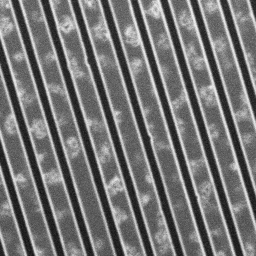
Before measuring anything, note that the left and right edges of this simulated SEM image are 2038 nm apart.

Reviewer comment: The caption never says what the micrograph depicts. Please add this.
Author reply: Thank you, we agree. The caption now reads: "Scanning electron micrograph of parallel lines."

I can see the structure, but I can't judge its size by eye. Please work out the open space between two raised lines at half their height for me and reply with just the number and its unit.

0.0706 um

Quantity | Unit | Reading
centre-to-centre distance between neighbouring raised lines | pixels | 28.6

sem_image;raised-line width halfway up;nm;157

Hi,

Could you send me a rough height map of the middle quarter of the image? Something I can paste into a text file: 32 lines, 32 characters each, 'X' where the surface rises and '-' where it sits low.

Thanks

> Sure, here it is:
-XXXXX---XXXXX--XXXXX---XXXXX--X
-XXXXX---XXXXX---XXXX---XXXXX--X
--XXXXX--XXXXX---XXXXX--XXXXX---
--XXXXX---XXXXX--XXXXX---XXXX---
--XXXXX---XXXXX--XXXXX---XXXXX--
---XXXXX--XXXXX---XXXXX--XXXXX--
X--XXXXX---XXXX---XXXXX---XXXX--
X--XXXXX---XXXXX--XXXXX---XXXXX-
X---XXXXX--XXXXX---XXXXX--XXXXX-
XX--XXXXX--XXXXX---XXXXX--XXXXX-
XX--XXXXX---XXXXX--XXXXX---XXXXX
XX---XXXX---XXXXX---XXXX---XXXXX
XXX--XXXXX--XXXXX---XXXXX--XXXXX
XXX--XXXXX---XXXXX--XXXXX---XXXX
XXX--XXXXXX--XXXXX--XXXXX---XXXX
XXX---XXXXX--XXXXX---XXXXX--XXXX
XXXX--XXXXX---XXXX---XXXXX--XXXX
XXXX--XXXXX---XXXXX--XXXXX---XXX
XXXX---XXXXX--XXXXX---XXXX---XXX
XXXX---XXXXX--XXXXX---XXXXX--XXX
XXXXX--XXXXX---XXXXX--XXXXX---XX
XXXXX---XXXX---XXXXX--XXXXX---XX
XXXXX---XXXXX--XXXXX---XXXXX--XX
-XXXXX--XXXXX---XXXX---XXXXX---X
-XXXXX--XXXXX---XXXXX--XXXXX---X
-XXXXX---XXXXX--XXXXX---XXXXX--X
--XXXX---XXXXX---XXXX---XXXXX--X
--XXXXX--XXXXX---XXXXX--XXXXX---
--XXXXX---XXXX---XXXXX---XXXX---
--XXXXX---XXXXX--XXXXX---XXXXX--
---XXXXX--XXXXX---XXXXX--XXXXX--
---XXXXX---XXXX---XXXXX--XXXXX--